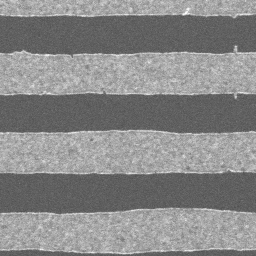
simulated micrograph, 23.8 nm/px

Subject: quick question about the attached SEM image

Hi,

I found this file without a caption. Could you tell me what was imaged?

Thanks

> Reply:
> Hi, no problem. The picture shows one or a few lines or trenches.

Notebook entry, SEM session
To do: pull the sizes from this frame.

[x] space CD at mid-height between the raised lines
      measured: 0.921 um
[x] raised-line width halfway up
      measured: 939 nm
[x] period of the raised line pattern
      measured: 78.8 pixels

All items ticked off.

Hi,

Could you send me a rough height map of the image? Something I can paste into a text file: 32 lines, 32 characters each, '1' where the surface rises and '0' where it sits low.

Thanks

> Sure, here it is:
11111111111111111111111111111111
11111111111111111111111111111111
00000000000000000000000000000000
00000000000000000000000000000000
00000000000000000000000000000000
00000000000000000000000000000000
00100000000000000000000000000100
11111111111111111111111111111111
11111111111111111111111111111111
11111111111111111111111111111111
11111111111111111111111111111111
11111111111111111111111111111111
00000000000000000000000000000000
00000000000000000000000000000000
00000000000000000000000000000000
00000000000000000000000000000000
00000000000011111111000000000001
11111111111111111111111111111111
11111111111111111111111111111111
11111111111111111111111111111111
11111111111111111111111111111111
11111111111111111111111011110000
00000000000000000000000000000000
00000000000000000000000000000000
00000000000000000000000000000000
00000000000000000000000000000000
00000000000000011111111111111000
11111111111111111111111111111111
11111111111111111111111111111111
11111111111111111111111111111111
11111111111111111111111111111111
00000000000000111100000000000000